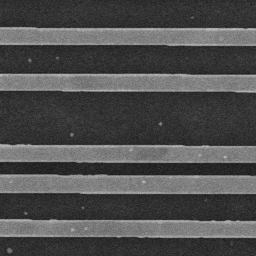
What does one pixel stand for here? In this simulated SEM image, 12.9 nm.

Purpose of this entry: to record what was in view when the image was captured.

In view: lines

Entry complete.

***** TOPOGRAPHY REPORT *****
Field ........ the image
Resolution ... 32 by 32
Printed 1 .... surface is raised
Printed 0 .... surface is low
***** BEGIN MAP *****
00000000000000000000000000000000
00000000000000000000000000000000
00000000000000000000000000000000
11110000000000000000000000000000
11111111111111111111111111111111
11111111111111111111111111111111
00000000000000000000000000000000
00000000000000000000000000000000
00000000000000000000000000000000
11111111111111111111111111111111
11111111111111111111111111111111
00000000000000000000000000000000
00000000000000000000000000000000
00000000000000000000000000000000
00000000000000000000000000000000
00000000000000000000000000000000
00000000000000000000000000000000
00000000000000000000000000000000
11111111111111111111111111111111
11111111111111111111111111111111
00000000000000000000000000000000
00000000000000000000000000000000
11111111111111111111111111111111
11111111111111111111111111111111
00000000000000000000000000000000
00000000000000000000000000000000
00000000000000000000000000000000
11010000000000000000000000000000
11111111111111111111111111111111
11111111111111111111111111111111
00000000000000000000000000000000
00000000000000000000000000000000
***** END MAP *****